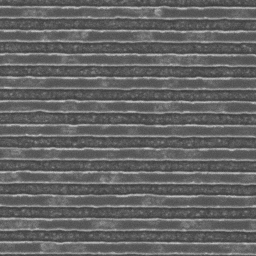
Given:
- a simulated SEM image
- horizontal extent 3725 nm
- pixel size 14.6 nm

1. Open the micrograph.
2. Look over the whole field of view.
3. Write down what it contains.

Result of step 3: parallel lines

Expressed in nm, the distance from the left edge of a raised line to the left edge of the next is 343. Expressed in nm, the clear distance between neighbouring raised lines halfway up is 171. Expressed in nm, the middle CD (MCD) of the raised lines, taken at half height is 169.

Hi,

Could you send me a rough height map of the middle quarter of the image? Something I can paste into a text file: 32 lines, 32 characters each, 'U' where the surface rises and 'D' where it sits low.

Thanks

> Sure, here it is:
DDDDDDDDDDDDDDDDDDDDDDDDDDDDDUUU
DDDDDDDDDDDDDDDDDDDDDDDDDDDDDDDD
DDDDDDDDDDDDDDDDDDDDDDDDDDDDDDDD
UUDDUDDUUUUDUUDDDUUUUUUUUUUUDDUU
UUUUUUUUUUUUUUUUUUUUUUUUUUUUUUUU
UUUUUUUUUUUUUUUUUUUUUUUUUUUUUUUU
DDDDDDDDDDDDDDDDDDDDDDDDDDDDDDDD
DDDDDDDDDDDDDDDDDDDDDDDDDDDDDDDD
DDDDDDDDDDDDDDDDDDDDDDDDDDDDDDDD
UUUUUUUUUUUUUUUUUUUUUUDUDDDDUUUD
UUUUUUUUUUUUUUUUUUUUUUUUUUUUUUUU
UUUUUUUUUUUUUUUUUUUUUUUUUUUUUUUU
DDDDDDDDDDDDDDDDDDDDDDDDDDDDDDDD
DDDDDDDDDDDDDDDDDDDDDDDDDDDDDDDD
DDDDDDDDDDDDDDDDDDDDDDDDDDDDDDDD
UUUUUUUUUUUUUUUUUUUUUDUUUUUUUUUU
UUUUUUUUUUUUUUUUUUUUUUUUUUUUUUUU
UUUUUUUUUUUUUUUUUUUUUUUUUUUUUUUU
DDDDDDDDDDDDDDDDDDDDDDDDDDDDDDDD
DDDDDDDDDDDDDDDDDDDDDDDDDDDDDDDD
DDDDDDDDDDDDDDDDDDDDDDDDDDDDDDDD
UUUUUUUUUUUUUUUUUUUUUUUUUUUUUUUU
UUUUUUUUUUUUUUUUUUUUUUUUUUUUUUUU
UUUUUUUUUUUUUUUUUUUUUUUUUUUUUUUU
DDDDDDDDDDDDDDDDDDDDDDDDDDDDDDDD
DDDDDDDDDDDDDDDDDDDDDDDDDDDDDDDD
DDDDDDDDDDDDDDDDDDDDDDDDDDDDDDDD
UUUUUUUUUUUUUUUUUUUUUUUUUUUUUUUU
UUUUUUUUUUUUUUUUUUUUUUUUUUUUUUUU
UUUUUUUUUUUUUUUUUUUUUUUUUUUUUUUU
DDDDDDDDDDDDDDDDDDDDDDDDDDDDDDDD
DDDDDDDDDDDDDDDDDDDDDDDDDDDDDDDD